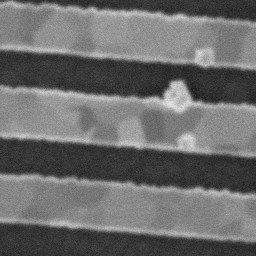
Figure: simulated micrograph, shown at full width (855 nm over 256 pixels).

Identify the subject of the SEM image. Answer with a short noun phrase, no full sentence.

lines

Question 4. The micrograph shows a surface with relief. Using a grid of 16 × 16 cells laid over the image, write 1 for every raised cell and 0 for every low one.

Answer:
1111100000000000
1111111111111111
1111111111111111
0000011111111111
0000000000000000
1000000000010000
1111111111111100
1111111111111111
1111111111111111
0000000000001111
0000000000000000
1111111100000000
1111111111111111
1111111111111111
0000000001111111
0000000000000000